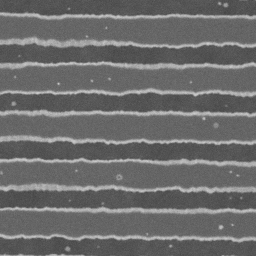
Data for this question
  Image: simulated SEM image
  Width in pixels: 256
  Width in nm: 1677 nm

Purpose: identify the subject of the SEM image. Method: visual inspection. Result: lines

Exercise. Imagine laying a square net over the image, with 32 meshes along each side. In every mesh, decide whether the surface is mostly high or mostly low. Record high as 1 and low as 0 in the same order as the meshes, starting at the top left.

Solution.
00000000000000000000000000000000
00000000000000000000000000000000
11111111111111111111111111111111
11111111111111111111111111111111
11111111111111111111111111111111
00000001110000111111111111111111
00000000000000000000000000000000
00000000000000000000000000000000
11111111111111111111111111111111
11111111111111111111111111111111
11111111111111111111111111111111
11111111110011111100111111111111
00000000000000000000000000000000
00000000000000000000000000000000
11111111111111111111111111111111
11111111111111111111111111111111
11111111111111111111111111111111
00000110111111111111111111111111
00000000000000000000000000000000
00000000000000000000000000000000
11111111111111111111111111111111
11111111111111111111111111111111
11111111111111111111111111111111
11111111111111111111111111111111
00000000000000000000000000000000
00000000000000000000000000000000
11111111111111111111111111111111
11111111111111111111111111111111
11111111111111111111111111111111
11111111111111111111111111111111
00000000000000000000000000000000
00000000000000000000000000000000